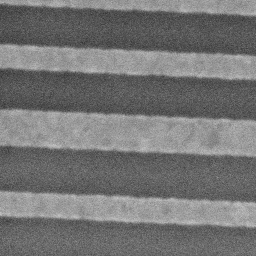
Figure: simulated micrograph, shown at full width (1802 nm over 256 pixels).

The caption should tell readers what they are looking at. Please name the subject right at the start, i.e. lines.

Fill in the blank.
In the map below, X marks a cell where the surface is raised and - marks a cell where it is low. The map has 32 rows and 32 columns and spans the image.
-XXXXXXXXXXXXXXXXXXXXXXXXXXXXXXX
--------------------------XXXXXX
--------------------------------
--------------------------------
--------------------------------
--------------------------------
XXXXXXXXXXXXXXXXXX--------------
XXXXXXXXXXXXXXXXXXXXXXXXXXXXXXXX
--XXXXXXXXXXXXXXXXXXXXXXXXXXXXXX
------------------------XXXXXXXX
--------------------------------
--------------------------------
--------------------------------
--------------------------------
XXXXXXXXXXXXXXXX----------------
XXXXXXXXXXXXXXXXXXXXXXXXXXXXXXXX
XXXXXXXXXXXXXXXXXXXXXXXXXXXXXXXX
XXXXXXXXXXXXXXXXXXXXXXXXXXXXXXXX
---------XXXXXXXXXXXXXXXXXXXXXXX
--------------------------------
--------------------------------
--------------------------------
--------------------------------
--------------------------------
XXXXXXXXXX----------------------
XXXXXXXXXXXXXXXXXXXXXXXXXXXXXXXX
XXXXXXXXXXXXXXXXXXXXXXXXXXXXXXXX
--------------XXXXXXXXXXXXXXXXXX
--------------------------------
--------------------------------
--------------------------------
--------------------------------